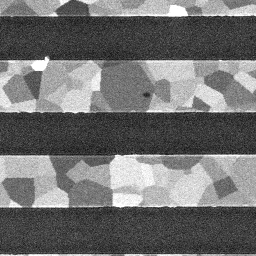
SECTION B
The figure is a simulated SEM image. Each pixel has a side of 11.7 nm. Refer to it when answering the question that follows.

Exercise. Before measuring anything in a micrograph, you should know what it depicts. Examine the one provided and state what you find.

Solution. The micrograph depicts lines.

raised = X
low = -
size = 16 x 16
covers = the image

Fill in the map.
XXXXXXXXXXXXXXXX
----------------
----------------
----------------
XXXXXXXXXXXXXXXX
XXXXXXXXXXXXXXXX
XXXXXXXXXXXXXXXX
----------------
----------------
----------------
XXXXXXXXXXXXXXXX
XXXXXXXXXXXXXXXX
XXXXXXXXXXXXXXXX
----------------
----------------
----------------